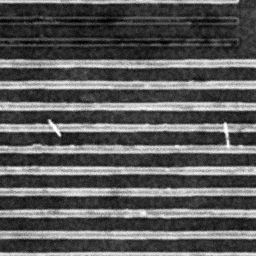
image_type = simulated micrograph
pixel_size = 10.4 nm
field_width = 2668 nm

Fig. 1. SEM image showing parallel lines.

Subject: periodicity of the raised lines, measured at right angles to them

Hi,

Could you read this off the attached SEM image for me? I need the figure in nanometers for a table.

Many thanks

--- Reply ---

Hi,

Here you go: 223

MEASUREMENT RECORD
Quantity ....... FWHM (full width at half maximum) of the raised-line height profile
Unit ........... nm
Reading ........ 58.6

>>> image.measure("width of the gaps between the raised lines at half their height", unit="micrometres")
0.165